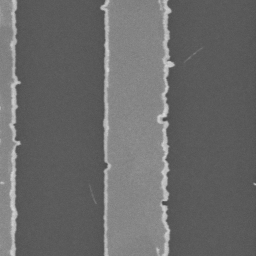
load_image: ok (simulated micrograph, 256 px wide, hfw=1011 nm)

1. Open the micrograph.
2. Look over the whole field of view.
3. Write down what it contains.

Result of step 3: one or a few lines or trenches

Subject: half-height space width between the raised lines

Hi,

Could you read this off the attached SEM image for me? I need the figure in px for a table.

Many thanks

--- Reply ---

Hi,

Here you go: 91.4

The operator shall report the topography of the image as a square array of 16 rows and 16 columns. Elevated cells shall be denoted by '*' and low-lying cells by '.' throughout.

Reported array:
*......***......
*......***......
*......***......
*......***......
*......****.....
*......***......
*......***......
*......***......
*......***......
*......***......
*......***......
*......***......
*......***......
*......***......
*......****.....
*......***......